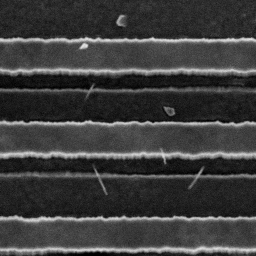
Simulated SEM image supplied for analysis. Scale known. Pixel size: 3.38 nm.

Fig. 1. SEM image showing lines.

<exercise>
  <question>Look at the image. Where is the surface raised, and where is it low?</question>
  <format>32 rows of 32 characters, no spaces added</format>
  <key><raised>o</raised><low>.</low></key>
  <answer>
................................
................................
................................
................................
................................
oooooooooooooooooooooooooooooooo
oooooooooooooooooooooooooooooooo
oooooooooooooooooooooooooooooooo
oooooooooooooooooooooooooooooooo
................................
................................
................................
................................
................................
................................
oooooooooooooooooooooooooooooooo
oooooooooooooooooooooooooooooooo
oooooooooooooooooooooooooooooooo
oooooooooooooooooooooooooooooooo
o....o..o....o.o....o..oo...oo..
................................
................................
................................
................................
................................
................................
................................
oooooooooooooooooooooooooooooooo
oooooooooooooooooooooooooooooooo
oooooooooooooooooooooooooooooooo
oooooooooooooooooooooooooooooooo
................................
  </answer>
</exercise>